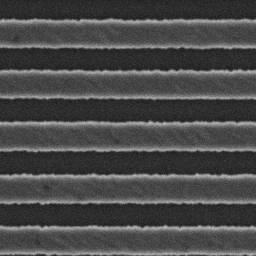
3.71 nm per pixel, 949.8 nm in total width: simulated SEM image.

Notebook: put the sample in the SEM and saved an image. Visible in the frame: lines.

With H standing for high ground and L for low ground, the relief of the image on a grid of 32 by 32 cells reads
LLLLLLLLLLLLLLLLLLLLLLLLLLLLLLLL
LLLLLLLLLLLLLLLLLLLLLLLLLLLLLLLL
HHHHHHLLHLHHLHHLLLHLHHHLHHHHHHHH
HHHHHHHHHHHHHHHHHHHHHHHHHHHHHHHH
HHHHHHHHHHHHHHHHHHHHHHHHHHHHHHHH
HHHHHHHHHHHHHHHHHHHHHHHHHHHHHHHH
LLLLLLLLLLLLLLLLLLLLLLLLLLLLLLLL
LLLLLLLLLLLLLLLLLLLLLLLLLLLLLLLL
LLLLLLLLLLLLLLLLLLLLLLLLLLLLLLLL
HHHHHHHHHHHHHHHHHHHHHHHHHHHHHHHH
HHHHHHHHHHHHHHHHHHHHHHHHHHHHHHHH
HHHHHHHHHHHHHHHHHHHHHHHHHHHHHHHH
LLLLLLLLLLLLLLLLLLLLLLLLLLLLLLLL
LLLLLLLLLLLLLLLLLLLLLLLLLLLLLLLL
LLLLLLLLLLLLLLLLLLLLLLLLLLLLLLLL
HHHHHHHHHHHHHHHHHHHHHHHHHHHHHHHH
HHHHHHHHHHHHHHHHHHHHHHHHHHHHHHHH
HHHHHHHHHHHHHHHHHHHHHHHHHHHHHHHH
HHHHHHHHHHHHHHHHHHHHHHHHHHHHHHHH
LLLLLLLLLLLLLLLLLLLLLLLLLLLLLLLL
LLLLLLLLLLLLLLLLLLLLLLLLLLLLLLLL
LLLLLLLLLLLLLLLLLLLLLLLLLLLLLLLL
HHHHHHHHHHHHHHHHHHHHHHHHHHHHHHHH
HHHHHHHHHHHHHHHHHHHHHHHHHHHHHHHH
HHHHHHHHHHHHHHHHHHHHHHHHHHHHHHHH
LLLLLLLLLLLLLLLLLLLLLLLLLLLLLLLL
LLLLLLLLLLLLLLLLLLLLLLLLLLLLLLLL
LLLLLLLLLLLLLLLLLLLLLLLLLLLLLLLL
HHHHHHHHHHHHHHHHHHHHHHHHHHHHHHHH
HHHHHHHHHHHHHHHHHHHHHHHHHHHHHHHH
HHHHHHHHHHHHHHHHHHHHHHHHHHHHHHHH
HHHHHHHHHHHHHHHHHHHHHHHHHHHHHHHH